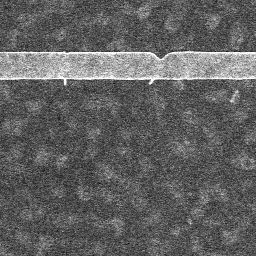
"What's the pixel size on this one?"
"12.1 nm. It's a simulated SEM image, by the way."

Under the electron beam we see one or a few lines or trenches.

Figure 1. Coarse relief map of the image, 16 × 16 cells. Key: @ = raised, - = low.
----------------
----------------
----------------
@@@@@@@@@@@@@@@@
@@@@@@@@@@@@@@@@
----------------
----------------
----------------
----------------
----------------
----------------
----------------
----------------
----------------
----------------
----------------